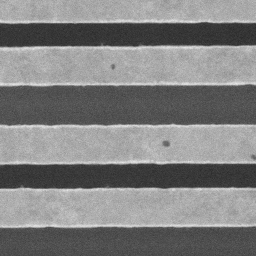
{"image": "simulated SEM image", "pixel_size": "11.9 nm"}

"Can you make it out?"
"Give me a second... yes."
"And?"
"lines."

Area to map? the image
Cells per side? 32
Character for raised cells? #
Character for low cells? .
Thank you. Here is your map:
################################
################################
################################
................................
................................
................................
################################
################################
################################
################################
###############################.
................................
................................
................................
................................
................................
################################
################################
################################
################################
#################..##...........
................................
................................
............................##..
################################
################################
################################
################################
................................
................................
................................
................................